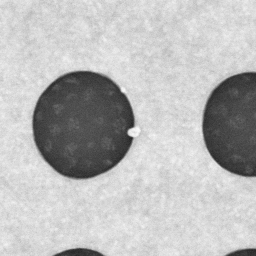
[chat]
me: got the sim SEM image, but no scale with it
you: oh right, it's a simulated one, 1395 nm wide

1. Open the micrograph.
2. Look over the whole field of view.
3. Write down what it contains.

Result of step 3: holes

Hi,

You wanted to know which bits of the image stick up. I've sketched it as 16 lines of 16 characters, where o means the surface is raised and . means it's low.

oooooooooooooooo
oooooooooooooooo
oooooooooooooooo
oooooooooooooooo
ooooo.ooooooooo.
ooo....oooooo...
oo......ooooo...
oo......ooooo...
oo......ooooo...
oo......ooooo...
ooo....ooooooo..
oooooooooooooooo
oooooooooooooooo
oooooooooooooooo
oooooooooooooooo
oooooooooooooooo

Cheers